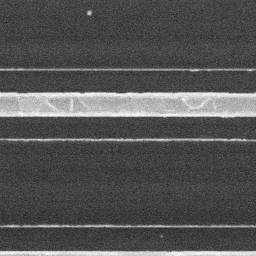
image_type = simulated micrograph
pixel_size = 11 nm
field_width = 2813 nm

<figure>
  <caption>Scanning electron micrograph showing lines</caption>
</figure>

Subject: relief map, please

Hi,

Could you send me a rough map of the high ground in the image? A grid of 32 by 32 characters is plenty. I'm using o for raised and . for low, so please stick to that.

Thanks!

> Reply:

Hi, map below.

oooooooooooooooooooooooooooooooo
oooooooooooooooooooooooooooooooo
oooooooooooooooooooooooooooooooo
oooooooooooooooooooooooooooooooo
oooooooooooooooooooooooooooooooo
oooooooooooooooooooooooooooooooo
oooooooooooooooooooooooooooooooo
oooooooooooooooooooooooooooooooo
oooooooooooooooooooooooooooooooo
................................
................................
................................
oooooooooooooooooooooooooooooooo
oooooooooooooooooooooooooooooooo
................................
................................
................................
ooooooooooooooooooooooooooooooo.
oooooooooooooooooooooooooooooooo
oooooooooooooooooooooooooooooooo
oooooooooooooooooooooooooooooooo
oooooooooooooooooooooooooooooooo
oooooooooooooooooooooooooooooooo
oooooooooooooooooooooooooooooooo
oooooooooooooooooooooooooooooooo
oooooooooooooooooooooooooooooooo
oooooooooooooooooooooooooooooooo
oooooooooooooooooooooooooooooooo
................................
................................
................................
................................